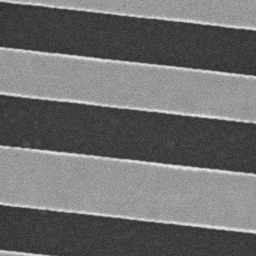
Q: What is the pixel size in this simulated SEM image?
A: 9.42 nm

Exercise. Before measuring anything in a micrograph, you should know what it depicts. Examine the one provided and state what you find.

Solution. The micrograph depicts lines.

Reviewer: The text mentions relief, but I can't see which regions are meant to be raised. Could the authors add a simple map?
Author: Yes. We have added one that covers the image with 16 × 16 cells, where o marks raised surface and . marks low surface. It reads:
....oooooooooooo
.............ooo
................
ooooo...........
oooooooooooooo..
oooooooooooooooo
......oooooooooo
...............o
................
oooo............
ooooooooooooo...
oooooooooooooooo
oooooooooooooooo
.......ooooooooo
................
................